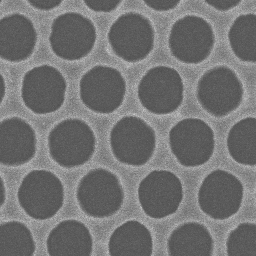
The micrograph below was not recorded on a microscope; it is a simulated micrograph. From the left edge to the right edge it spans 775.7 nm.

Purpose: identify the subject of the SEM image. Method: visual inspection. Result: a regular array of holes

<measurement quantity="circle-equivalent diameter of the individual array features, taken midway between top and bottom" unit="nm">140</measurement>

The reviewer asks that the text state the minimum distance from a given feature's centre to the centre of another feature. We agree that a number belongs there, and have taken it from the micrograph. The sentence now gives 178 nanometers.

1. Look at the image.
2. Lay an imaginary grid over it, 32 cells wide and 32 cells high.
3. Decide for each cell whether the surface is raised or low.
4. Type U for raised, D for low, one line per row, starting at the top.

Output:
UUUUDDDUUUUDDDDUUUDDDDUUUUDDDDUU
UUUUUUUUUUUUUUUUUUUUUUUUUUUUUUUU
DDDDUUUDDDDUUUUDDDUUUUDDDUUUUUDD
DDDDUUUDDDDDUUDDDDDUUDDDDDUUUDDD
DDDDUUDDDDDDUUDDDDDUUDDDDDDUUDDD
DDDDUUDDDDDDUUDDDDDUUDDDDDDUUDDD
DDDDUUUDDDDUUUDDDDDUUDDDDDUUUDDD
UDDUUUUUUUUUUUUUDUUUUUUDDUUUUUDD
UUUUDDDUUUUUDDUUUUUDDUUUUUUDUUUU
UUUDDDDDUUDDDDDUUUDDDDUUUDDDDUUU
DUUDDDDDUUDDDDDDUDDDDDDUUDDDDDUU
DUUDDDDDUUDDDDDDUDDDDDDUUDDDDDUU
UUUDDDDDUUDDDDDUUUDDDDDUUDDDDDUU
UUUUDDDUUUUDDDDUUUDDDDUUUUDDDUUU
UUUUUUUUUUUUUUUUUUUUUUUUUUUDUUUU
DDDUUUUDDDDUUUUDDDUUUUDDDDUUUUDD
DDDDUUDDDDDDUUDDDDDUUDDDDDDUUDDD
DDDDUUDDDDDDUUDDDDDUUDDDDDDUDDDD
DDDDUUDDDDDDUUDDDDDUUDDDDDDUDDDD
DDDDUUDDDDDUUUDDDDDUUUDDDDUUUDDD
DDUUUUUDDDUUUUUUDDUUUUUDDUUUUUDD
UUUUDDUUUUUDDUUUUUUDDUUUUUUDUUUU
UUUDDDDUUUDDDDDUUUDDDDUUUUDDDDUU
UUDDDDDDUUDDDDDUUDDDDDDUUDDDDDUU
DUDDDDDDUUDDDDDUUDDDDDDUUDDDDDUU
UUUDDDDDUUDDDDDUUUDDDDUUUDDDDDUU
UUUDDDDUUUUDDDUUUUDDDDUUUUDDDDUU
UUUUUUUUUUUUUUUUUUUUUUUUUUUUUUUU
DDDUUUUDDDDUUUUDDDUUUUDDDDUUUUDD
DDDDUUDDDDDUUUDDDDDUUDDDDDUUUDDD
DDDDUUDDDDDUUUDDDDDUUDDDDDDUDDDD
DDDDUUDDDDDUUUDDDDDUUDDDDDUUDDDD